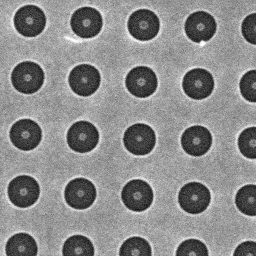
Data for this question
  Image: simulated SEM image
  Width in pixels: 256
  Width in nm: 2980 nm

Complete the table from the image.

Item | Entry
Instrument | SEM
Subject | an array of small figures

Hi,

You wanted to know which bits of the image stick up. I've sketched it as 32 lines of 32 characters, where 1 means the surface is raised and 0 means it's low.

11111111111111111111111111111111
11000111100011111001111100111111
11000011100001110000111000011100
11000011100001110000111000011100
11100111110011110000111000011100
11111111111111111111111111111110
11111111111111111111111111111111
11111111111111111111111111111111
11000111100011111001111101111111
10000011100001110000111000011100
10000111100001110000111000011100
11000111100011110001111000011100
11111111111111111111111111111110
11111111111111111111111111111111
11111111111111111111111111111111
11000111100011111011111111111111
10000111000011110001111000111100
10000111000011100000111000011100
11001111100011110001111000111100
11111111111111111011111101111100
11111111111111111111111111111111
11111111111111111111111111111111
10000111100111110011111111111111
10000111000011100001111000111100
10000111000011100001110000111000
11001111000011100001110000111000
11111111111111111011111001111100
11111111111111111111111111111111
11111111111111111111111111111111
10001111100111111111111111111111
10000111000011100001110000111100
10000111000011100001110000111000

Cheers